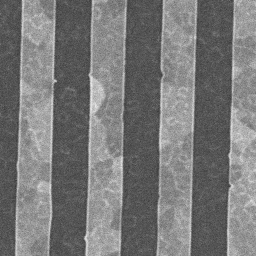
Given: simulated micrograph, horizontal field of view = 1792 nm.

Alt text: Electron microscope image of one or a few lines or trenches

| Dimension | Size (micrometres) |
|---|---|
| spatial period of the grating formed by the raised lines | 0.493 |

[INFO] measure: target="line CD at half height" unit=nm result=226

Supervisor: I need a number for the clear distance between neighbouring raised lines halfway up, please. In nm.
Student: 270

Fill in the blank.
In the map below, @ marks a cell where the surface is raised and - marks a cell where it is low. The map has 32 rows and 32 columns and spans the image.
---@@@@-----@@@@-----@@@@----@@@
---@@@@-----@@@@----@@@@@----@@@
---@@@@-----@@@@----@@@@@----@@@
---@@@@----@@@@@----@@@@-----@@@
---@@@@----@@@@@----@@@@-----@@@
---@@@@----@@@@@----@@@@-----@@@
---@@@@----@@@@@----@@@@-----@@@
---@@@@----@@@@@----@@@@-----@@@
---@@@@----@@@@-----@@@@-----@@@
---@@@@----@@@@-----@@@@-----@@@
---@@@@----@@@@-----@@@@-----@@@
---@@@@----@@@@-----@@@@-----@@@
---@@@@----@@@@-----@@@@-----@@@
---@@@-----@@@@-----@@@@-----@@@
---@@@-----@@@@-----@@@@-----@@@
---@@@-----@@@@-----@@@@-----@@@
--@@@@-----@@@@-----@@@@-----@@@
--@@@@-----@@@@-----@@@@-----@@@
--@@@@-----@@@@-----@@@@-----@@@
--@@@@-----@@@@-----@@@@-----@@@
--@@@@-----@@@@-----@@@@-----@@@
--@@@@-----@@@@-----@@@@-----@@@
--@@@@-----@@@@-----@@@@-----@@@
--@@@@-----@@@@-----@@@@-----@@@
--@@@@-----@@@@-----@@@@-----@@@
--@@@@-----@@@@-----@@@@-----@@@
--@@@@-----@@@@-----@@@@-----@@@
--@@@@-----@@@@-----@@@@-----@@@
--@@@@-----@@@@-----@@@@-----@@@
--@@@@-----@@@@-----@@@@-----@@@
--@@@@-----@@@@-----@@@@-----@@@
--@@@@-----@@@@-----@@@@-----@@@